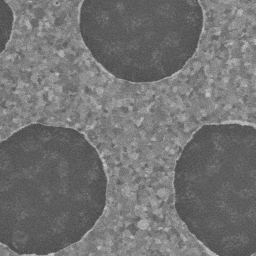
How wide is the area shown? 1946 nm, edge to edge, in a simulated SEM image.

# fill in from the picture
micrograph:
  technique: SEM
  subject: holes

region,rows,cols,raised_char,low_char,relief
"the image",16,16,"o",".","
.oooo........ooo
.oooo........ooo
.oooo........ooo
oooooo......oooo
ooooooo....ooooo
oooooooooooooooo
oooooooooooooooo
oooooooooooooooo
o....ooooooo....
......ooooo.....
.......oooo.....
.......oooo.....
.......oooo.....
......ooooo.....
.....ooooooo....
o...ooooooooo...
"